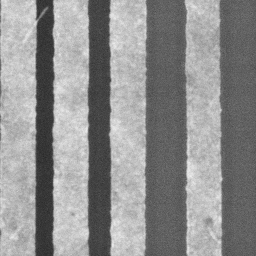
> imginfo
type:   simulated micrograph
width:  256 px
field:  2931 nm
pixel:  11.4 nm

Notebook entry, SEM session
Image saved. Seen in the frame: lines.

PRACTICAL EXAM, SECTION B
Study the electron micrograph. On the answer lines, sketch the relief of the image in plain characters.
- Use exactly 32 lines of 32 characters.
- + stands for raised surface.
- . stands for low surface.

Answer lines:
++++...++++...++++.....++++.....
++++...++++...++++.....++++.....
+++++..++++...++++.....++++.....
++++...++++...++++.....++++.....
++++...++++...++++.....++++.....
++++...++++...++++.....++++.....
++++...++++...++++.....++++.....
++++...++++...++++.....++++.....
++++...++++...++++.....++++.....
++++...++++...++++.....++++.....
++++...++++...++++.....++++.....
++++...++++...++++.....++++.....
++++...++++...++++.....++++.....
++++...++++...++++.....+++++....
++++...++++...++++.....++++.....
++++...++++...++++.....++++.....
++++...++++...++++......++++....
++++...++++...++++......++++....
++++...++++...++++.....++++.....
++++...++++...++++.....+++++....
++++...++++...++++.....+++++....
++++...++++...++++.....+++++....
++++...++++...++++.....+++++....
++++...++++...++++.....+++++....
++++...++++...++++.....+++++....
++++...++++...++++.....+++++....
++++...++++...++++.....+++++....
++++...++++...++++.....+++++....
++++...++++...++++.....+++++....
++++...++++...++++.....+++++....
++++...++++...++++.....+++++....
++++...++++...++++.....+++++....